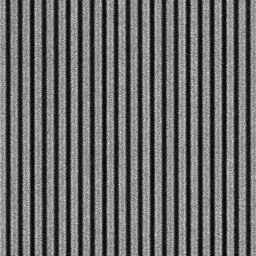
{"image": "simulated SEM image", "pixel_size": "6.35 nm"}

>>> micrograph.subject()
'parallel lines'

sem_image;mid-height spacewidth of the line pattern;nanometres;28.6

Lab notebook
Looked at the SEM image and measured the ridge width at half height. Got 46 nm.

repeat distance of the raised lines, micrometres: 0.0762